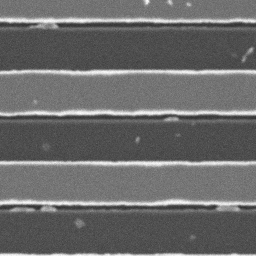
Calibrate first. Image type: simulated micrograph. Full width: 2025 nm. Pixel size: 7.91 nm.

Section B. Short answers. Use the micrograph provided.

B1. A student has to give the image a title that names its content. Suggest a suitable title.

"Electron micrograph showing lines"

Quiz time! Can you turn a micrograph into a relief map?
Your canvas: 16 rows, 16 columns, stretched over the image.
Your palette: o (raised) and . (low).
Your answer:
oooooooooooooooo
................
................
................
oooooooooooooooo
oooooooooooooooo
oooooooooooooooo
................
................
................
oooooooooooooooo
oooooooooooooooo
oooooooooooooooo
................
................
................